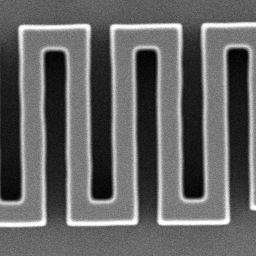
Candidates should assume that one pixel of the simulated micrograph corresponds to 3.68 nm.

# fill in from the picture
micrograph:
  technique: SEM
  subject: groups of lines, slits or small figures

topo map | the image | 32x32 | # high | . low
................................
................................
................................
...########...########...#######
...########...#########..#######
...########...#########..#######
...###..###...###...###..###...#
...##...###...###...###..###...#
...##...###...###...###..###...#
...##...###...###...###..###...#
...##...###...###...###..###...#
...##...###...###...###..###...#
...##...###...###...###..###...#
...##...###...###...###..###...#
...##...###...###...###..###...#
...###..###...###...###..###...#
...###..###...###...###..###...#
...###..###...###...###..###...#
...###..###...###...###..###...#
...###..###...###...###...##...#
...###..###...###...###...##...#
...###..###...###...###...##...#
...###..###...###...###...##...#
...###..###...###...###...##...#
...###..###...###...###..###...#
######..#########...########...#
######..#########...########....
######..#########...########....
................................
................................
................................
................................